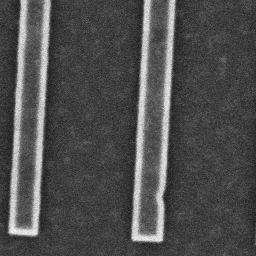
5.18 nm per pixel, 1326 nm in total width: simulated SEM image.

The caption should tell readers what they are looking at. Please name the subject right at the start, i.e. one or a few lines or trenches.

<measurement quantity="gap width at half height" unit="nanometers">514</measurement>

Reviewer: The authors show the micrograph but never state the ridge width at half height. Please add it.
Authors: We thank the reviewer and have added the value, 125 nanometres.